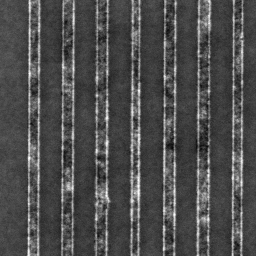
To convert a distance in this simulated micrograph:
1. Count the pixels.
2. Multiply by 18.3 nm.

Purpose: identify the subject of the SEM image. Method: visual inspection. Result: parallel lines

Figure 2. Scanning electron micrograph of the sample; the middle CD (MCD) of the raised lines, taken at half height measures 0.176 micrometres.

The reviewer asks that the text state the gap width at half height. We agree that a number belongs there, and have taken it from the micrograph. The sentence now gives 438 nm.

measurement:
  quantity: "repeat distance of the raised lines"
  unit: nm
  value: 619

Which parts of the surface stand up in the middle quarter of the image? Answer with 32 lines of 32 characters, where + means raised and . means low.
++......+++......++......+++....
++......+++......++......+++....
++......+++......++......+++....
++......+++......++......+++....
++......+++......++......+++....
++......+++......++......+++....
++......+++......++......+++....
++......+++......++......+++....
++......+++......++......+++....
++......+++......++......+++....
++......+++......++......+++....
++......+++......++......+++....
++......+++......++......+++....
++......+++......++......+++....
++......+++......++......+++....
++......+++......++......++.....
++......+++......++......+++....
++......+++......++......+++....
++......+++......++......+++....
++......+++......++......+++....
++......+++......++......+++....
++......+++......++......+++....
++......+++......++......+++....
++......+++......++......+++....
++......+++......++......+++....
++......+++......++......+++....
++......+++......++......+++....
++......+++......++......+++....
++......+++......++......+++....
++......+++......++......+++....
++......+++......++......+++....
++......+++......+.......+++....